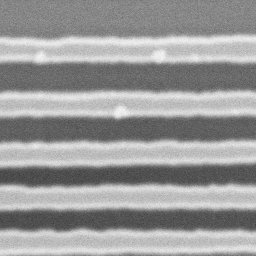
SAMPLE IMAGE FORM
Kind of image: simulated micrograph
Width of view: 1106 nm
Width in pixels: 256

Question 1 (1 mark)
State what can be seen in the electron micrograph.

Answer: lines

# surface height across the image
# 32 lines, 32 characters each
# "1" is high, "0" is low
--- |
00000000000000000000000000000000
00000000000000000000000000000000
00000000000000000000000000000000
00000000000000000000000000000000
00000000000000000000000000000000
11111111111111111111111111111111
11111111111111111111111111111111
10001111111111111111111111111111
00000000000000000000000000000000
00000000000000000000000000000000
00000000000000000000000000000000
00000000000000000000000000000000
11111111111111111111111111111111
11111111111111111111111111111111
00000000000000110000000000000000
00000000000000000000000000000000
00000000000000000000000000000000
00000000000000000000000000000000
11111111111111111111111111111111
11111111111111111111111111111111
11111111111111111000010000000000
00000000000000000000000000000000
00000000000000000000000000000000
11100011011111111111111111111111
11111111111111111111111111111111
11111111111111111111111111111111
00000000000000000000000000000000
00000000000000000000000000000000
00000000000000000000000000000000
11111111111111111111111111111111
11111111111111111111111111111111
11111111111111100001111110000000